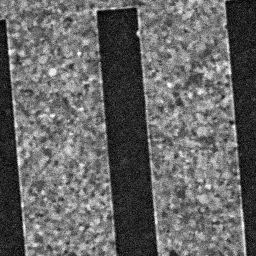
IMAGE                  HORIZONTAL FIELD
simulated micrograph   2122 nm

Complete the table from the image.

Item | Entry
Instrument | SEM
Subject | one or a few lines or trenches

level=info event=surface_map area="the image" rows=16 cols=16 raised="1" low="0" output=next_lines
1111111111111100
1111110001111100
0111110001111100
0111110001111100
0111110001111100
0111110001111100
0111110001111110
0111111001111110
0111111001111110
0111111001111110
0111111001111110
0111111000111110
0111111000111110
0111111000111110
0011111000111110
0011111000111110